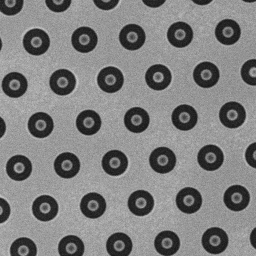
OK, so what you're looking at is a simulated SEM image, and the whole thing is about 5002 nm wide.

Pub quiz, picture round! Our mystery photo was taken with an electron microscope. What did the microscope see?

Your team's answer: an array of small figures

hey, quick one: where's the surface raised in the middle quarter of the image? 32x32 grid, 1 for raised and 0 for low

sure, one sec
11111111111011111111110001111111
01111111100000111111100000111111
00111111000000011111000100011111
00011111001110011111001110011111
10011111001110011111000000011111
00011111000000011111100000111111
00011111100000111111111001111111
00111111111111111111111111111111
11111111111111111111111111111111
11111111111111111111111111111111
11111111111111111111111111110000
11111001111111110000111111100000
11110000011111100000011111100110
11100010011111100110011111100110
11100110001111100110001111100010
11100110011111100000011111110000
11100000011111110000111111111001
11111000111111111111111111111111
11111111111111111111111111111111
11111111111111111111111111111111
11111111111111111111111101111111
11111111111100111111110000011111
00111111110000011111110000001111
00001111110010001111100011001111
11001111100011001111100011001111
11001111100011001111100000001111
00001111110000001111110000011111
00011111111000011111111101111111
00111111111111111111111111111111
11111111111111111111111111111111
11111111111111111111111111111111
11111111111111111100111111111000